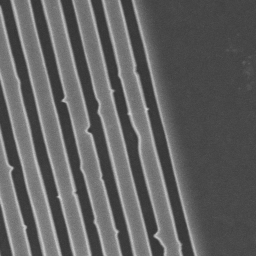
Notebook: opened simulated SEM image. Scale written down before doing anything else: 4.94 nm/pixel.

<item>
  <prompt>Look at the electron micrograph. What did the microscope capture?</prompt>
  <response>parallel lines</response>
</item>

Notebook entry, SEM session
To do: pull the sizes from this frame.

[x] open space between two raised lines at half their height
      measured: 60.5 nanometers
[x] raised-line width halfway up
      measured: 0.0834 um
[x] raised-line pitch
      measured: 145 nm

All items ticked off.